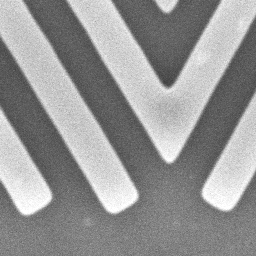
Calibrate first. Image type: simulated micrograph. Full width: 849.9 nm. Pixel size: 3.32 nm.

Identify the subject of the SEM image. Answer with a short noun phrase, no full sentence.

groups of lines, slits or small figures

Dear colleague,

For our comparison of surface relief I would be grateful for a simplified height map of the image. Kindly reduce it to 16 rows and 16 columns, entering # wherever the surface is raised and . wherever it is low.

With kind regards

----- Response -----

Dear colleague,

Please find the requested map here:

##...##...#...##
##...###.....###
###...##....###.
.##...###...###.
.###...###.###..
..###...#####...
...##...#####...
...###...###...#
#...###..###...#
##..###...#...##
##...###.....###
###...##.....##.
.##...##.....##.
................
................
................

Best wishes